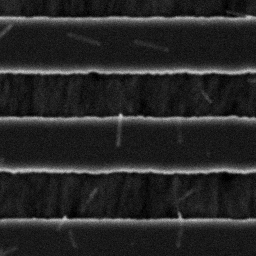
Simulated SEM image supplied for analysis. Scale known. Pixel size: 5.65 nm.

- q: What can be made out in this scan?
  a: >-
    lines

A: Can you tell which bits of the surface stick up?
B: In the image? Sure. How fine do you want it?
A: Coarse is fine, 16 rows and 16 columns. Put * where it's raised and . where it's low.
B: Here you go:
................
****************
****************
****************
****************
................
................
****************
****************
****************
****************
................
................
................
****************
****************